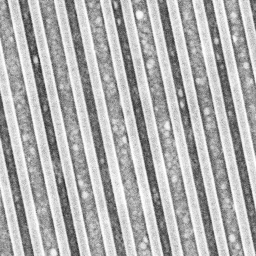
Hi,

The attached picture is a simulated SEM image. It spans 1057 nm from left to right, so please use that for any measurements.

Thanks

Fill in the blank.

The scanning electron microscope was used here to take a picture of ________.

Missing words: parallel lines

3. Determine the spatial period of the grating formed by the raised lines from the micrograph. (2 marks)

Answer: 93.2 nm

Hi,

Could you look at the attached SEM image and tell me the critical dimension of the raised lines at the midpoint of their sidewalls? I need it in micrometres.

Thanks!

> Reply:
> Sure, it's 0.04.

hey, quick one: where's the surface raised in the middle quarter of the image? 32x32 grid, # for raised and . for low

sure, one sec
.##...##.....##...##....###..##.
.##...###....##...##....###..###
..##..###....##...##.....##..###
..##...##....##...##.....##...##
..##...##....###..###....##...##
..##...##.....##...##....###..##
..##...###....##...##....###..##
...##..###....##...##.....##...#
...##...##....###..##.....##...#
...##...##....###...##....##...#
...##...##.....##..###....###..#
...###..###....##...##....###..#
....##..###....##...##.....##...
....##...##....###..##.....##...
....##...##....###...##....##...
....##...##.....##...##....###..
....###..###....##...##....###..
.....##...##....##...##.....##..
.....##...##....###..###....##..
#....##...##....###..###....##..
#....##...###....##...##....###.
#....###..###....##...##....###.
#.....##...##....##...##.....##.
#.....##...##....###..###....##.
##....##...##....###..###....##.
##....##...###....##...##....###
##....###..###....##...##.....##
##.....##...##....##...##.....##
###....##...##....###..###....##
###....##...##....###...##....##
.##....##...###....##...##....##
.##....###..###....##...##.....#